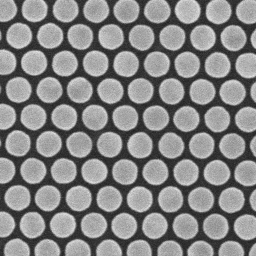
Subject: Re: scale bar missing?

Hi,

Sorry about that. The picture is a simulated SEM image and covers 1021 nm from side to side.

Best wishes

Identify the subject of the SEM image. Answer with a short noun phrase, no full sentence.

a regular array of raised bodies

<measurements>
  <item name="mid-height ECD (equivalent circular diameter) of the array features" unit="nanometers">100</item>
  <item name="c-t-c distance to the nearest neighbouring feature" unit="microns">0.121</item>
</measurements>